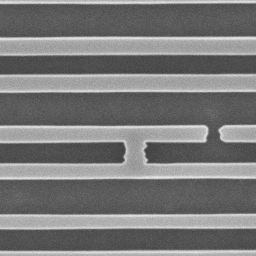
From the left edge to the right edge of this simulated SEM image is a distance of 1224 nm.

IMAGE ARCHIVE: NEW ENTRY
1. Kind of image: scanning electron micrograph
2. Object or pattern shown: parallel lines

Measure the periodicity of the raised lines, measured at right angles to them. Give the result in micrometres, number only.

0.21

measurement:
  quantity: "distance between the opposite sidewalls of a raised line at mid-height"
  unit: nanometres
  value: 74.7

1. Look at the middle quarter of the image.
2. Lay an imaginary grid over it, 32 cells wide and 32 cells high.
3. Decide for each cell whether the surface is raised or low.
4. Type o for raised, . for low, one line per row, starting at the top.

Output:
................................
................................
................................
oooooooooooooooooooooooooooooooo
oooooooooooooooooooooooooooooooo
oooooooooooooooooooooooooooooooo
oooooooooooooooooooooooooooooooo
................................
................................
................................
................................
................................
................................
................................
................................
................................
oooooooooooooooooooooooooooooooo
oooooooooooooooooooooooooooooooo
oooooooooooooooooooooooooooooooo
...............oooooo...........
...............oooooo...........
................oooo............
...............ooooo............
...............ooooo............
...............ooooo............
oooooooooooooooooooooooooooooooo
oooooooooooooooooooooooooooooooo
oooooooooooooooooooooooooooooooo
ooooooo.........................
................................
................................
................................